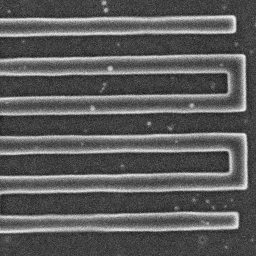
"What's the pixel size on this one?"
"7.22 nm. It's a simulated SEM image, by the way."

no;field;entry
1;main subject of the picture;groups of lines, slits or small figures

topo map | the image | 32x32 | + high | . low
................................
................................
+++++++++++++++++++++++++++++...
+++++++++++++++++++++++++++++...
................................
................................
................................
+++++++++++++++++++++++++++++++.
+++++++++++++++++++++++++++++++.
............................+++.
.............................++.
............................+++.
+++++++++++++++++++++++++++++++.
++++++++++++++++++++++++++++++..
................................
................................
................................
+++++++++++++++++++++++++++++++.
+++++++++++++++++++++++++++++++.
.............................++.
.............................++.
............................+++.
+++++++++++++++++++++++++++++++.
++++++++++++++++++++++++++++++..
................................
................................
................................
++++++++++++++++++++++++++++++..
+++++++++++++++++++++++++++++...
................................
................................
................................